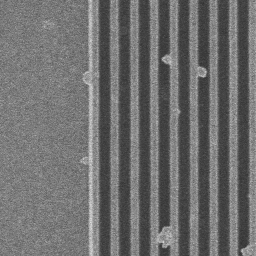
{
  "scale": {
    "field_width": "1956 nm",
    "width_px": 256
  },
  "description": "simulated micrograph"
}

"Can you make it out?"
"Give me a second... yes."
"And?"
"parallel lines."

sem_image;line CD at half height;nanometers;69.7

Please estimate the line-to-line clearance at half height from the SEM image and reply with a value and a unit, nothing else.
84 nm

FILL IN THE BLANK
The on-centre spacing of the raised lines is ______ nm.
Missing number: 151